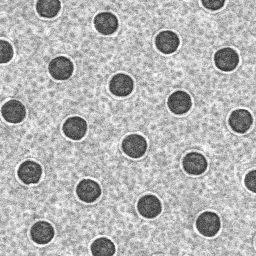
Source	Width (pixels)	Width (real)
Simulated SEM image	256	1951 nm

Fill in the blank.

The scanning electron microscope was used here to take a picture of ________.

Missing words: a regular array of holes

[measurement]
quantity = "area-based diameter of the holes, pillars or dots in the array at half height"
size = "194 nm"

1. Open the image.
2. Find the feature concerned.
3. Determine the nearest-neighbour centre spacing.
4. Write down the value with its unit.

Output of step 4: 469 nm